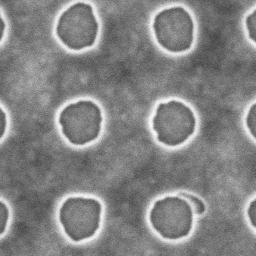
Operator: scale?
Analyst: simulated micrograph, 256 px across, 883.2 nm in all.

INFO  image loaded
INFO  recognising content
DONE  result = holes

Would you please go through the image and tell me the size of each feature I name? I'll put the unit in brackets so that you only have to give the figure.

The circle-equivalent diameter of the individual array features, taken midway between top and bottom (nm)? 152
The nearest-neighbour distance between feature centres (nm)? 319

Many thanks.